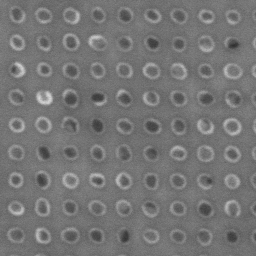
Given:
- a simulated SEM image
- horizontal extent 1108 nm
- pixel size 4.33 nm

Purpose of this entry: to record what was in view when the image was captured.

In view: a regular array of raised bodies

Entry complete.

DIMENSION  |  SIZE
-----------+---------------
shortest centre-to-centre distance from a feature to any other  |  115 nanometres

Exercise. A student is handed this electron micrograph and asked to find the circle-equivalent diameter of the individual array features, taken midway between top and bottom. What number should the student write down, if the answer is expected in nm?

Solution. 64